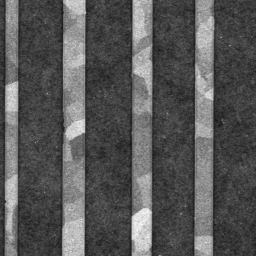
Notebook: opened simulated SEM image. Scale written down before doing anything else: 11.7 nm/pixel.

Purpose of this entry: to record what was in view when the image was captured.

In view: one or a few lines or trenches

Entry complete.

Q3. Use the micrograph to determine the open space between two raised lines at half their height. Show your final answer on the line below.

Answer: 530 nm